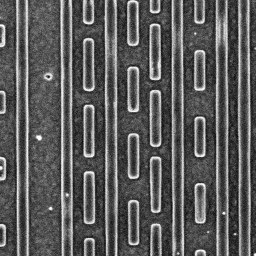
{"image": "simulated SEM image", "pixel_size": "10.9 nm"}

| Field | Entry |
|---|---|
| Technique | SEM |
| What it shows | wiring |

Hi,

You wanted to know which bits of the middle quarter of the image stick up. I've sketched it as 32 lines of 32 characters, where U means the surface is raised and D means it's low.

UUDDDUUDDDDUUDDDDDDDDDUUDDDUUUDD
UUDDDUUDDDDUUDDDUUUDDDUUDDDUUUDD
UUDDDUUDDDDUUDDDUUUDDDUUDDDUUUDD
UUDDDUUDDDDUUDDDUUUDDDUUDDDUUUDD
UUDDDUUDDDDUUDDDUUUDDDDDDDDUUUDD
UUDDDUUDDDDUUDDDUUUDDDDDDDDUUUDD
UUDDDUUDDDDUUDDDUUUDDDDDDDDUUUDD
UUDDDDDDDDDUUDDDUUUDDDUUDDDUUUDD
UUDDDDDDDDDUUDDDUUUDDDUUDDDUUUDD
UUDDDDDDDDDUUDDDUUUDDDUUDDDUUUDD
UUDDDUUDDDDUUDDDUUUDDDUUDDDUUUDD
UUDDDUUDDDDUUDDDUUUDDDUUDDDUUUDD
UUDDDUUDDDDUUDDDDDDDDDUUDDDUUUDD
UUDDDUUDDDDUUDDDDDDDDDUUDDDUUUDD
UUDDDUUDDDDUUDDDDDDDDDUUDDDUUUDD
UUDDDUUDDDDUUDDDDDDDDDUUDDDUUUDD
UUDDDUUDDDDUUDDDDDDDDDUUDDDUUUDD
UUDDDUUDDDDUUDDDDDDDDDUUDDDUUUDD
UUDDDUUDDDDUUDDDUUUDDDUUDDDUUUDD
UUDDDUUDDDDUUDDDUUUDDDUUDDDUUUDD
UUDDDUUDDDDUUDDDUUUDDDUUDDDUUUDD
UUDDDUUDDDDUUDDDUUUDDDDDDDDUUUDD
UUDDDUUDDDDUUDDDUUUDDDDDDDDUUUDD
UUDDDDDDDDDUUDDDUUUDDDUUDDDUUUDD
UUDDDDDDDDDUUDDDUUUDDDUUDDDUUUDD
UUDDDDDDDDDUUDDDUUUDDDUUDDDUUUDD
UUDDDDDDDDDUUDDDUUUDDDUUDDDUUUDD
UUDDDUUDDDDUUDDDUUUDDDUUDDDUUUDD
UUDDDUUDDDDUUDDDDDDDDDUUDDDUUUDD
UUDDDUUDDDDUUDDDDDDDDDUUDDDUUUDD
UUDDDUUDDDDUUDDDDDDDDDUUDDDUUUDD
UUDDDUUDDDDUUDDDDDDDDDUUDDDUUUDD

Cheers